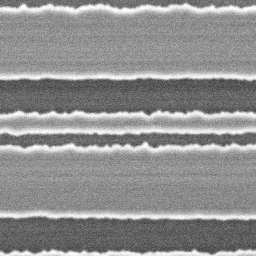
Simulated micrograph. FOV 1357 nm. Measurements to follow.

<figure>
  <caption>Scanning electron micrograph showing lines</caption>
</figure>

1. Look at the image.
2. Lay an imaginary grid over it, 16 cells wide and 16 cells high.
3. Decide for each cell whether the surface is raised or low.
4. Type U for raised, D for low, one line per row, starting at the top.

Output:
UUUUUUUUUUUUUUUU
UUUUUUUUUUUUUUUU
UUUUUUUUUUUUUUUU
UUUUUUUUUUUUUUUU
UUUUUUUUUUUUUUUU
DDDDDDDDDDDDDDDD
DDDDDDDDDDDDDDDD
UUUUUUUUUUUUUUUU
UUUUUUUUUUUUUUUU
UUUUUUUUUUUUUUUU
UUUUUUUUUUUUUUUU
UUUUUUUUUUUUUUUU
UUUUUUUUUUUUUUUU
UUDUUUUUUUUUUUUU
DDDDDDDDDDDDDDDD
DDDDDDDDDDDDDDDD